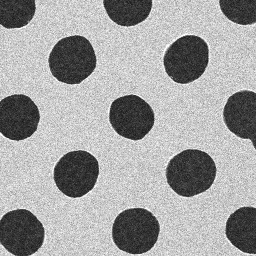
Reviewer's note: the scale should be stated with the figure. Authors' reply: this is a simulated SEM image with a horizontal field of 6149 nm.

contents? holes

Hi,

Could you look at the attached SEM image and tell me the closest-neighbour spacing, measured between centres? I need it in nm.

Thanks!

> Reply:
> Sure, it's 1920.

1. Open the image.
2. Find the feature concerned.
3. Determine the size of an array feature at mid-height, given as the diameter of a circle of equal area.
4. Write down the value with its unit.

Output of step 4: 1.14 micrometres